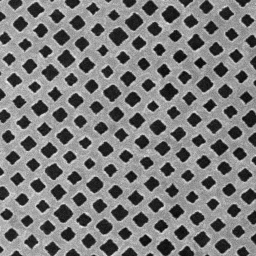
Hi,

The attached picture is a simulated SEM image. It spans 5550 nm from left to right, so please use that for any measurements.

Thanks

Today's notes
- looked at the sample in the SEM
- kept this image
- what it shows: a regular array of holes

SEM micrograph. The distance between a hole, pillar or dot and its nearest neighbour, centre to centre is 458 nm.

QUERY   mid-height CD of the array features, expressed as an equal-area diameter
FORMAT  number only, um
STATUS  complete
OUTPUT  0.288